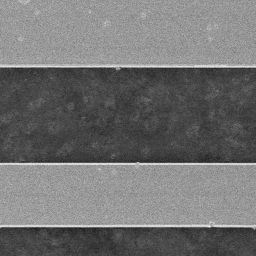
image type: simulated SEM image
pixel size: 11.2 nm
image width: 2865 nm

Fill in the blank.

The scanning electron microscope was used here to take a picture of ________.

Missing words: one or a few lines or trenches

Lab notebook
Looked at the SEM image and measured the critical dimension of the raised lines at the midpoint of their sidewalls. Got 700 nm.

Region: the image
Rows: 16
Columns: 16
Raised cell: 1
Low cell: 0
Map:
1111111111111111
1111111111111111
1111111111111111
1111111111111111
0000000000000000
0000000000000000
0000000000000000
0000000000000000
0000000000000000
0000000000000000
1111111111111111
1111111111111111
1111111111111111
1111111111111111
0000000000000000
0000000000000000